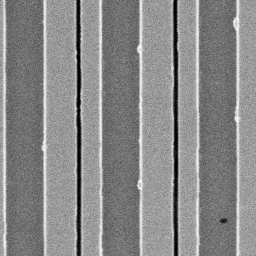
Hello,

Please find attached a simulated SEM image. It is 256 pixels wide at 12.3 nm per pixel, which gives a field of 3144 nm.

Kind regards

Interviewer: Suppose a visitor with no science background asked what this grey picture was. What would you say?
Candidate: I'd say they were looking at lines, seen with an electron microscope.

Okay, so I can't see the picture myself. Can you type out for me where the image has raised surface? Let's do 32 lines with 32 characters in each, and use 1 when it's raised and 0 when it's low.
10000011111110000011111110000011
10000011111110000011111110000011
10000011111110000011111110000111
10000011111110000011111110000111
10000011111110000011111110000011
10000011111110000011111110000011
10000011111110000111111110000011
10000011111110000011111110000011
10000011111110000011111110000011
10000011111110000011111110000011
10000011111110000011111110000011
10000011111110000011111110000011
10000011111110000011111110000011
10000011111110000011111110000011
10000011111110000011111110000111
10000011111110000011111110000011
10000011111110000011111110000011
10000011111110000011111110000011
10000111111110000011111110000011
10000011111110000011111110000011
10000011111110000011111110000011
10000011111110000011111110000011
10000011111110000111111110000011
10000011111110000111111110000011
10000011111110000011111110000011
10000011111110000011111110000011
10000011111110000011111110000011
10000011111110000011111110000011
10000011111110000011111110000011
10000011111110000011111110000011
10000011111110000011111110000011
10000011111110000011111110000011